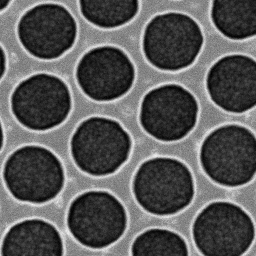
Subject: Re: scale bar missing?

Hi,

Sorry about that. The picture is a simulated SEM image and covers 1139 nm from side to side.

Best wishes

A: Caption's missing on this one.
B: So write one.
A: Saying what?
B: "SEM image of a regular array of holes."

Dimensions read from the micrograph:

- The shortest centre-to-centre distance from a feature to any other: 318 nanometres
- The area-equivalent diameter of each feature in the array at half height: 258 nm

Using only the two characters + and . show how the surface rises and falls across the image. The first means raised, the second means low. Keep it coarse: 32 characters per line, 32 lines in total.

.++++..+++.......++++++++++.....
+++......+.......+++++++++......
+++......++.....+++.....+++.....
++........+++.++++.......++.....
++.......+++++++++.......+++....
+++......+++++++++.......+++++++
++++....+++....+++.......+++++++
.+++++++++......+++.....+++.....
.+++++++++.......+++...+++......
++++...+++.......+++++++++......
++......++.......+++++++++......
++.......+......+++.....++......
+........+++..++++......+++.....
+........+++++++++.......+++...+
++......++++++++++.......+++++++
+++....+++.....+++......++++++++
+++++++++.......++......+++....+
+++++++++.......++++..++++......
+++..++++.......+++++++++.......
+......++.......+++++++++.......
+.......++.....+++.....++.......
........+++...+++.......++......
+.......+++++++++.......+++....+
+.......+++++++++.......++++++++
++.....+++....+++.......++++++++
+++++++++......++.......++...+++
+++++++++.......+++...+++......+
+++..+++........++++++++.......+
+......++.......++++++++........
+......++......++.....++........
........++....+++......+.......+
........+++++++++......++......+